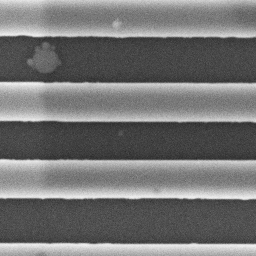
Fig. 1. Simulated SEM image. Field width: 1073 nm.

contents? lines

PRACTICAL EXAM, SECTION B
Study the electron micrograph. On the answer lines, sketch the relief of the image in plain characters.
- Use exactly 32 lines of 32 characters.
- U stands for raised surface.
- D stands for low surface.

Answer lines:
UUUUUUUUUUUUUUUUUUUUUUUUUUUUUUUU
UUUUUUUUUUUUUUUUUUUUUUUUUUUUUUUU
UUUUUUUUUUUUUUUUUUUUUUUUUUUUUUUU
UUUUUUUUUUUUUUUUUUUUUUUUUUUUUUUU
DDDDUUUUUUUUUUUUUUUUUUUUUUUUUUUU
DDDDDDDDDDDDDDDDDDDDDDDDDDDDDDDD
DDDDDDDDDDDDDDDDDDDDDDDDDDDDDDDD
DDDDDDDDDDDDDDDDDDDDDDDDDDDDDDDD
DDDDDDDDDDDDDDDDDDDDDDDDDDDDDDDD
DDDDDDDDDDDDDDDDDDDDDDDDDDDDDDDD
UUUUUUUUUUUUUUUUUUUUUUUUUUUUUUUU
UUUUUUUUUUUUUUUUUUUUUUUUUUUUUUUU
UUUUUUUUUUUUUUUUUUUUUUUUUUUUUUUU
UUUUUUUUUUUUUUUUUUUUUUUUUUUUUUUU
UUUUUUUUUUUUUUUUUUUUUUUUUUUUUUUU
DDDDDDDDDDDDDDDDDDDDDDDDDDDDDDDD
DDDDDDDDDDDDDDDDDDDDDDDDDDDDDDDD
DDDDDDDDDDDDDDDDDDDDDDDDDDDDDDDD
DDDDDDDDDDDDDDDDDDDDDDDDDDDDDDDD
DDDDDDDDDDDDDDDDDDDDDDDDDDDDDDDD
UUUUUUUUUUUUUUUUUUUUUUUUUUUUUUUU
UUUUUUUUUUUUUUUUUUUUUUUUUUUUUUUU
UUUUUUUUUUUUUUUUUUUUUUUUUUUUUUUU
UUUUUUUUUUUUUUUUUUUUUUUUUUUUUUUU
UUUUUUUUUUUUUUUUUUUUUUUUUUUUUUUU
DDDDDDDDDDDDDDDDDDDDDDDDDDDDDDDD
DDDDDDDDDDDDDDDDDDDDDDDDDDDDDDDD
DDDDDDDDDDDDDDDDDDDDDDDDDDDDDDDD
DDDDDDDDDDDDDDDDDDDDDDDDDDDDDDDD
DDDDDDDDDDDDDDDDDDDDDDDDDDDDDDDD
UUUUUUUUUUUUUUDDDDDDDDDDUDDDDDDD
UUUUUUUUUUUUUUUUUUUUUUUUUUUUUUUU